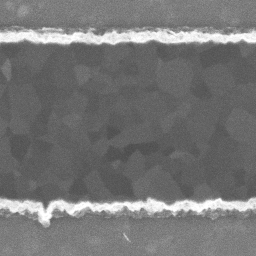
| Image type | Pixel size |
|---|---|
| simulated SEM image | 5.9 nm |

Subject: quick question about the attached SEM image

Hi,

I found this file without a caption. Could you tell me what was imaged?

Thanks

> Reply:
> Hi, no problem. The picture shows one or a few lines or trenches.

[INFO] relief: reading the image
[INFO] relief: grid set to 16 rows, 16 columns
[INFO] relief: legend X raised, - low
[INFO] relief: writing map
----------------
----------------
XXXXXXXXXXXXXXXX
XXXXXXXXXXXXXXXX
XXXXXXXXXXXXXXXX
XXXXXXXXXXXXXXXX
XXXXXXXXXXXXXXXX
XXXXXXXXXXXXXXXX
XXXXXXXXXXXXXXXX
XXXXXXXXXXXXXXXX
XXXXXXXXXXXXXXXX
XXXXXXXXXXXXXXXX
XXXXXXXXXXXXXXXX
----------------
----------------
----------------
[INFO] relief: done